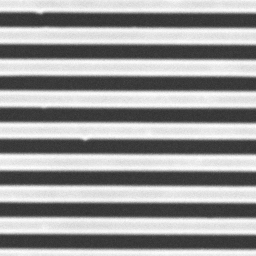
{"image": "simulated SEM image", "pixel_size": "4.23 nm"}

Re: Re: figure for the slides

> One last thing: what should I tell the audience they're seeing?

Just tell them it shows parallel lines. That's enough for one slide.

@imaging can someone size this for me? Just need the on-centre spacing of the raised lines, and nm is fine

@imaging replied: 134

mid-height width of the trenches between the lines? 69.3 nm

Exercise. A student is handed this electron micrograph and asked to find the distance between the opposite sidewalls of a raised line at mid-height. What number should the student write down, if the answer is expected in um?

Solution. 0.065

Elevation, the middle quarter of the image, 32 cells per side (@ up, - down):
@@@@@@@@@@@@@@@@@@@@@@@@@@@@@@@@
@@@@@@@@@@@@@@@@@@@@@@@@@@@@@@@@
@@@@@@@@@@@@@@@@@@@@@@@@@@@@@@@@
--------------------------------
--------------------------------
--------------------------------
--------------------------------
@@@@@@@@@@@@@@@@@@@@@@@@@@@@@@@@
@@@@@@@@@@@@@@@@@@@@@@@@@@@@@@@@
@@@@@@@@@@@@@@@@@@@@@@@@@@@@@@@@
@@@@@@@@@@@@@@@@@@@@@@@@@@@@@@@@
--------------------------------
--------------------------------
--------------------------------
--------------------------------
@@@@@@@@@@@@@@@@@@@@@@@@@@@@@@@@
@@@@@@@@@@@@@@@@@@@@@@@@@@@@@@@@
@@@@@@@@@@@@@@@@@@@@@@@@@@@@@@@@
----@@--@@@@@@@@@@@@@@@@@@@@@@@@
--------------------------------
--------------------------------
--------------------------------
--------------------------------
@@@@@@@@@@@@@@@@@@@@@@@@@@@@@@@@
@@@@@@@@@@@@@@@@@@@@@@@@@@@@@@@@
@@@@@@@@@@@@@@@@@@@@@@@@@@@@@@@@
-----------------------@@@@@@@@@
--------------------------------
--------------------------------
--------------------------------
--------------------------------
@@@@@@@@@@@@@@@@@@@@@@@@@@@@@@@@